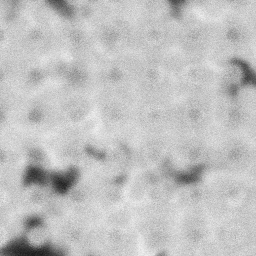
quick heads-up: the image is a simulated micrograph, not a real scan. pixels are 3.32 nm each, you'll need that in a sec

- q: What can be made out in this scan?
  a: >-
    a regular array of raised bodies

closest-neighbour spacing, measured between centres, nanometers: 130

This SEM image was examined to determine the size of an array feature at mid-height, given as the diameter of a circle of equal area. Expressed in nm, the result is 65.4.